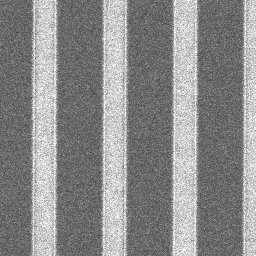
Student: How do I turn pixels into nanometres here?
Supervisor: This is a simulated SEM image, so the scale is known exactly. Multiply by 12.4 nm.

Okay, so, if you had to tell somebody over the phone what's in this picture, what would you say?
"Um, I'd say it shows one or a few lines or trenches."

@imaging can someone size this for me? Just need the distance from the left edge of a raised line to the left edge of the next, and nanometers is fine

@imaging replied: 874